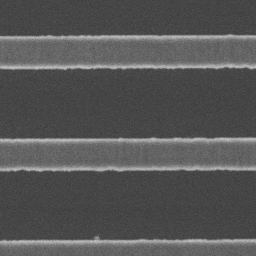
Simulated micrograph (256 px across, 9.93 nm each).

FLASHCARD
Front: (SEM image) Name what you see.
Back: lines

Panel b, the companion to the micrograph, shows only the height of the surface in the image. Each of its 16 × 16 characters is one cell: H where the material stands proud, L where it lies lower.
LLLLLLLLLLLLLLLL
LLLLLLLLLLLLLLLL
HHHHHHHHHHHHHHHH
HHHHHHHHHHHHHHHH
LLLLLLLLLLLLLLLL
LLLLLLLLLLLLLLLL
LLLLLLLLLLLLLLLL
LLLLLLLLLLLLLLLL
LLLLLLLLLLLLLLLL
HHHHHHHHHHHHHHHH
HHHHHHHHHHHHHHHH
LLLLLLLLLLLLLLLL
LLLLLLLLLLLLLLLL
LLLLLLLLLLLLLLLL
LLLLLLLLLLLLLLLL
HHHHHHHHHHHHHHHH